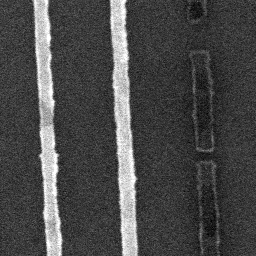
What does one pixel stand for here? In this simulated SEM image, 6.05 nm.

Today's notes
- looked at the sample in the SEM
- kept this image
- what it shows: one or a few lines or trenches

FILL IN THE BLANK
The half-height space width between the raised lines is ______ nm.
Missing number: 387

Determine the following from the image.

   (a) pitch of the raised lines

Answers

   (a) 472 nm